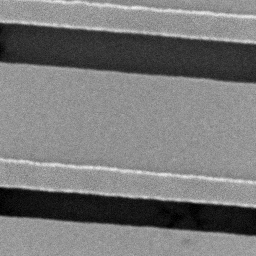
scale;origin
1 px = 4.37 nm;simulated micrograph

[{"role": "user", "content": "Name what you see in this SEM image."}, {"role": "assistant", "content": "lines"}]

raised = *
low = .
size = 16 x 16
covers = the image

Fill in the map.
****************
..**************
..............**
................
*******.........
****************
****************
****************
****************
****************
****************
****************
...........*****
................
*************...
****************